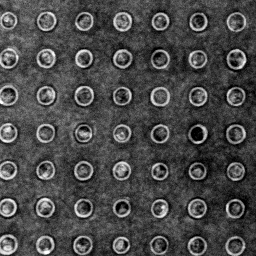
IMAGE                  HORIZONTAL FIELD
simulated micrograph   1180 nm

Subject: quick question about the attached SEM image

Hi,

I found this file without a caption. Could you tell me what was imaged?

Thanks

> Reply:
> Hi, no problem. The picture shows a regular array of raised bodies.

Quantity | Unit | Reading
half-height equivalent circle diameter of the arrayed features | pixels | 17.2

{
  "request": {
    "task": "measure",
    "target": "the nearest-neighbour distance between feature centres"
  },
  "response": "171 nm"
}